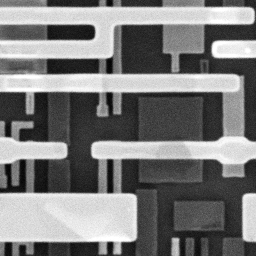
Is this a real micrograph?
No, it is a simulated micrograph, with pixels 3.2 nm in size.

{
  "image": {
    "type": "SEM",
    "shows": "wiring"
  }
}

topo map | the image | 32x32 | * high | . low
................................
********************************
********************************
............**..................
............**..................
**************.............*****
**************.............*****
................................
................................
******************************..
******************************..
................................
................................
................................
................................
................................
................................
**.........................****.
********....********************
********....********************
................................
................................
................................
................................
*****************..............*
*****************.............**
*****************.............**
*****************.............**
*****************.............**
*****************.............**
................................
................................